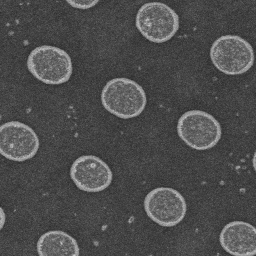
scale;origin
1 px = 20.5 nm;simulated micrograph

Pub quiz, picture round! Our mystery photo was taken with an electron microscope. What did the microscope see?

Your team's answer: raised bodies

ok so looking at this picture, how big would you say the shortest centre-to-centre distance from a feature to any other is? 1670 nanometres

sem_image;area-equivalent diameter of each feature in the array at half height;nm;790